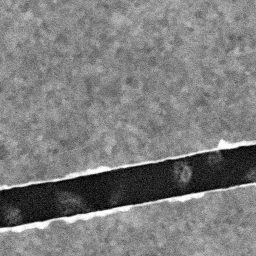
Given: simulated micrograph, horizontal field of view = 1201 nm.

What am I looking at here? one or a few lines or trenches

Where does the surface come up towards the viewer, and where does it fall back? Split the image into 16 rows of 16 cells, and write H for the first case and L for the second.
HHHHHHHHHHHHHHHH
HHHHHHHHHHHHHHHH
HHHHHHHHHHHHHHHH
HHHHHHHHHHHHHHHH
HHHHHHHHHHHHHHHH
HHHHHHHHHHHHHHHH
HHHHHHHHHHHHHHHH
HHHHHHHHHHHHHHHH
HHHHHHHHHHHHHHHH
HHHHHHHHHHHHHLLL
HHHHHHHLLLLLLLLL
HHLLLLLLLLLLLLLL
LLLLLLLLLLHHHHHH
LLLLLHHHHHHHHHHH
HHHHHHHHHHHHHHHH
HHHHHHHHHHHHHHHH